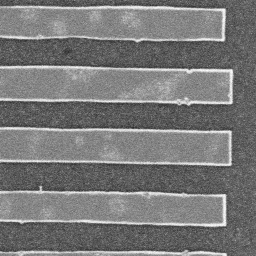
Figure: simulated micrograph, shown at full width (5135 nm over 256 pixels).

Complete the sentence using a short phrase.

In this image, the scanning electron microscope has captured one or a few lines or trenches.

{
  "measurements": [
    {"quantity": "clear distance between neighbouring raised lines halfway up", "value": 584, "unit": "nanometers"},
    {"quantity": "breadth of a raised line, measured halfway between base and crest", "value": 657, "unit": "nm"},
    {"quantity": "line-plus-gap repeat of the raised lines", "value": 1240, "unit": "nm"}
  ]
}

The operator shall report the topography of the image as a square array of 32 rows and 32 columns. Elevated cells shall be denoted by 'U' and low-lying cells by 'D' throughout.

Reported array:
DDDDDDDDDDDDDDDDDDDDDDDDDDDDDDDD
UUUUUUUUUUUUUUUUUUUUUUUUUUUUDDDD
UUUUUUUUUUUUUUUUUUUUUUUUUUUUDDDD
UUUUUUUUUUUUUUUUUUUUUUUUUUUUDDDD
UUUUUUUUUUUUUUUUUUUUUUUUUUUUDDDD
DDDDDDDDDDDDDDDDDDDDDDDDDDDDDDDD
DDDDDDDDDDDDDDDDDDDDDDDDDDDDDDDD
DDDDDDDDDDDDDDDDDDDDDDDDDDDDDDDD
UUUUUUUUUUUUDDDDDDDDDDDDDDDDDDDD
UUUUUUUUUUUUUUUUUUUUUUUUUUUUUDDD
UUUUUUUUUUUUUUUUUUUUUUUUUUUUUDDD
UUUUUUUUUUUUUUUUUUUUUUUUUUUUUDDD
DDDDDDUUUUUUUUUUUUUUUUUUUUUUUDDD
DDDDDDDDDDDDDDDDDDDDDDDDDDDDDDDD
DDDDDDDDDDDDDDDDDDDDDDDDDDDDDDDD
DDDDDDDDDDDDDDDDDDDDDDDDDDDDDDDD
UUUUUUUUUUUUUUUUUUUUUUUUDDUUDDDD
UUUUUUUUUUUUUUUUUUUUUUUUUUUUUDDD
UUUUUUUUUUUUUUUUUUUUUUUUUUUUUDDD
UUUUUUUUUUUUUUUUUUUUUUUUUUUUUDDD
DDDDDDDDDDDDDDDDDDDDDDDUUUUUUDDD
DDDDDDDDDDDDDDDDDDDDDDDDDDDDDDDD
DDDDDDDDDDDDDDDDDDDDDDDDDDDDDDDD
DDDDDDDDDDDDDDDDDDDDDDDDDDDDDDDD
UUUUUUUUUUUUUUUUUUUUUUUUUUUUDDDD
UUUUUUUUUUUUUUUUUUUUUUUUUUUUDDDD
UUUUUUUUUUUUUUUUUUUUUUUUUUUUDDDD
UUUUUUUUUUUUUUUUUUUUUUUUUUUUDDDD
DDDDDDDDDDDDDDDDDDDDDDDDDDDDDDDD
DDDDDDDDDDDDDDDDDDDDDDDDDDDDDDDD
DDDDDDDDDDDDDDDDDDDDDDDDDDDDDDDD
DDUDUUUDDUUUUUDDDDDDDDDUDDDDDDDD